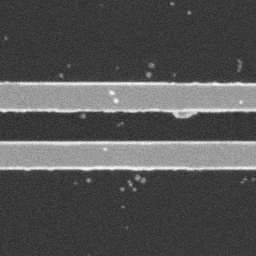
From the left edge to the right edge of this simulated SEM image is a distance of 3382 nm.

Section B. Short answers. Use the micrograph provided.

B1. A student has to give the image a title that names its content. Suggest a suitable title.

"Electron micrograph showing lines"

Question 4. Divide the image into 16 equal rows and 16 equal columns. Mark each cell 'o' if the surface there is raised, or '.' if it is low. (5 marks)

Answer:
................
................
................
................
................
oooooooooooooooo
oooooooooooooooo
................
................
oooooooooooooooo
oooooooooooooooo
................
................
................
................
................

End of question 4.